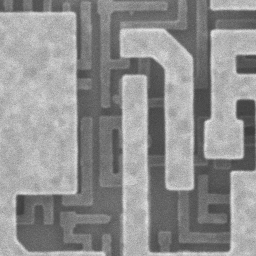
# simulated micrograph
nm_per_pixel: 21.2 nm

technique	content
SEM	wiring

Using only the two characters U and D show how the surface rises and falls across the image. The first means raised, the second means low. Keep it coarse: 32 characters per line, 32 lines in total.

DDDDDDDDDDDDDDDDDDDDDDDDDDUUUUUU
DDDDDDDDDDDDDDDDDDDDDDDDDDDDDDDD
UUUUUUUUUDDDDDDDDDDDDDDDDDDDDDDD
UUUUUUUUUDDDDDDDDDDDDDDDDDDDDDDD
UUUUUUUUUDDDDDDUUUUUUDDDDDUUUUUU
UUUUUUUUUDDDDDDUUUUUUUDDDDUUUUUU
UUUUUUUUUDDDDDDUUUUUUUUDDDUUUUUU
UUUUUUUUUDDDDDDDDDDDUUUUDDUUUDDD
UUUUUUUUUDDDDDDDDDDDUUUUDDUUUDDD
UUUUUUUUUDDDDDDDUUDDDUUUDDUUUUUU
UUUUUUUUUDDDDDDUUUDDDUUUDDUUUUUU
UUUUUUUUUDDDDDDUUUDDDUUUDDUUUUUU
UUUUUUUUUDDDDDDUUUDDDUUUDDUUUUDD
UUUUUUUUUUDDDDDUUUDDDUUUDDUUUDDD
UUUUUUUUUUDDDDDUUUDDDUUUDDUUUUDD
UUUUUUUUUUDDDDDUUUDDDUUUDDUUUUDD
UUUUUUUUUUDDDDDUUUDDDUUUDDUUUUDD
UUUUUUUUUUDDDDDUUUDDDUUUDDUUUUDD
UUUUUUUUUUDDDDDUUUDDDUUUDDUUUUDD
UUUUUUUUUUDDDDDUUUDDDUUUDDUUUUDD
UUUUUUUUUUDDDDDUUUDDDUUUDDDDDDDD
UUUUUUUUUUDDDDDUUUDDDUUUDDDDDUUU
UUUUUUUUUUDDDDDUUUDDDUUUDDDDDUUU
UUUUUUUUUUDDDDDUUUDDDUUUDDDDDUUU
UUDDDDDDDDDDDDDUUUDDDDDDDDDDDUUU
UUDDDDDDDDDDDDDUUUDDDDDDDDDDDUUU
UUDDDDDDDDDDDDDUUUDDDDDDDDDDDUUU
UUDDDDDDDDDDDDDUUUDDDDDDDDDDDUUU
UUDDDDDDDDDDDDDUUUDDDDDDDDDDDUUU
UUDDDDDDDDDDDDDUUUDDDDDDDDDDDUUU
UUUDDDDDDDDDDDDUUUDDDDDDDDDDDUUU
UUUUDDDUUUUDDDDUUUUDDDDDDDDDUUUU